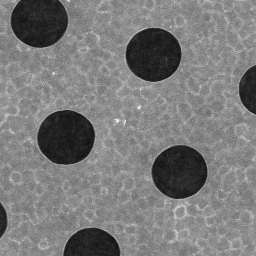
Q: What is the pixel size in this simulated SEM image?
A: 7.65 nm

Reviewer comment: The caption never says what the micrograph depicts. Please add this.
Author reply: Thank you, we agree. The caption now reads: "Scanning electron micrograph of holes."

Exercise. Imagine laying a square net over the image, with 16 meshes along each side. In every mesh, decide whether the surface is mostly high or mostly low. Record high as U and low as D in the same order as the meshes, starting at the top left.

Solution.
UDDDUUUUUUUUUUUU
UDDDUUUUUUUUUUUU
UDDDUUUUDDDUUUUU
UUUUUUUUDDDUUUUU
UUUUUUUUDDDUUUUD
UUUUUUUUUUUUUUUD
UUUUUUUUUUUUUUUD
UUUDDUUUUUUUUUUU
UUDDDDUUUUUUUUUU
UUUDDDUUUUDDUUUU
UUUUUUUUUUDDDUUU
UUUUUUUUUUDDDUUU
UUUUUUUUUUUUUUUU
UUUUUUUUUUUUUUUU
UUUUUDDUUUUUUUUU
UUUUDDDUUUUUUUUU